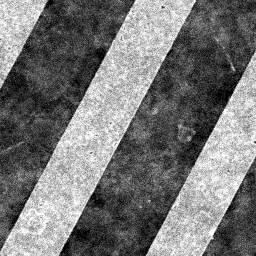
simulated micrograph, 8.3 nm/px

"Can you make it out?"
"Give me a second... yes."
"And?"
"one or a few lines or trenches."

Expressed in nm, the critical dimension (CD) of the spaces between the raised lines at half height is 643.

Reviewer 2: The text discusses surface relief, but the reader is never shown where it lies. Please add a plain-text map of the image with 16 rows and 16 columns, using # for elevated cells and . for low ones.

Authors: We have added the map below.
###.....####....
##......###.....
##.....####.....
#......###......
#.....####.....#
......###......#
.....####.....##
....####......##
....####...#.###
...####......###
...####.....####
..####......###.
..###......###..
.####.....####..
.###......###...
####.....####...